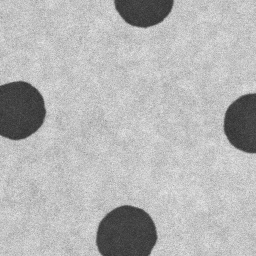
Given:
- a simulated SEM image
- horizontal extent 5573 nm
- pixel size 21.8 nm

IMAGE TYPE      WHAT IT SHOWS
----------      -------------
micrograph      holes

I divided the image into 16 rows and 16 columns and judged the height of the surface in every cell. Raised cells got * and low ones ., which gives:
*******....*****
********..******
****************
****************
****************
..**************
...***********..
...***********..
..************..
***************.
****************
****************
****************
*******..*******
******....******
******....******